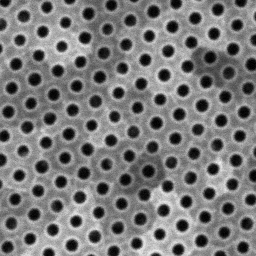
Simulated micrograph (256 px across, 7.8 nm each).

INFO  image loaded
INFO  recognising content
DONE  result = a regular array of holes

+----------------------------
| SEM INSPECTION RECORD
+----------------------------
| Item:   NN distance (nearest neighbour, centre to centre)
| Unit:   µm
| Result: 0.188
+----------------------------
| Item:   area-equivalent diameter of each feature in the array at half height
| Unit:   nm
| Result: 115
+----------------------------